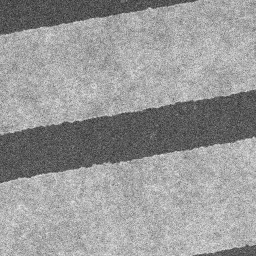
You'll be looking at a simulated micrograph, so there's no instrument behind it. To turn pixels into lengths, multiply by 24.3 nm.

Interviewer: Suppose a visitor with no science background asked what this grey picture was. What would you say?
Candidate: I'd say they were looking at one or a few lines or trenches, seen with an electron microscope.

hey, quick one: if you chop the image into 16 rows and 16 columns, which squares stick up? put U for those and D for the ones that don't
DDDDDDDDDDUUUUUU
DDDDUUUUUUUUUUUU
UUUUUUUUUUUUUUUU
UUUUUUUUUUUUUUUU
UUUUUUUUUUUUUUUU
UUUUUUUUUUUUUUUU
UUUUUUUUUUUDDDDD
UUUUUDDDDDDDDDDD
DDDDDDDDDDDDDDDD
DDDDDDDDDDDUUUUU
DDDDDUUUUUUUUUUU
UUUUUUUUUUUUUUUU
UUUUUUUUUUUUUUUU
UUUUUUUUUUUUUUUU
UUUUUUUUUUUUUUUU
UUUUUUUUUUUUUUUD